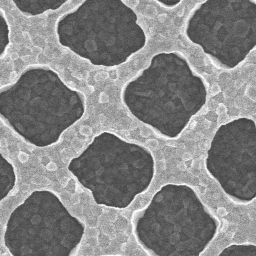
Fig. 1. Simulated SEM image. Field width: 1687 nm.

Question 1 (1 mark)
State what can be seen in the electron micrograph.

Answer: holes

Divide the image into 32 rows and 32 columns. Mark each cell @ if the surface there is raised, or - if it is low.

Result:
@@------@@------@@@@--@@@-------
@@@--@@@@--------@@@@@@@--------
-@@@@@@----------@@@@@@@--------
-@@@@@@-----------@@@@@---------
-@@@@@@-----------@@@@@---------
-@@@@@@@----------@@@@@@@-------
@@@@@@@@@--------@@@@@@@@@-----@
@@@@@@@@@@@-----@@@----@@@@---@@
@@@@--@@@@@@@@@@@@------@@@@-@@@
@@@----@@@@@@@@@@--------@@@@@@@
@@------@@@@@@@@---------@@@@@@@
----------@@@@@@----------@@@@@@
----------@@@@@-----------@@@@@@
-----------@@@@@---------@@@@@@@
----------@@@@@@@-------@@@@@@@@
@--------@@@@@@@@@-----@@@@@----
@@------@@@@@@@@@@@@---@@@@-----
@@@----@@@@@---@@@@@@@@@@@@-----
@@@@@@@@@@@-------@@@@@@@@------
@@@@@@@@@@---------@@@@@@@------
-@@@@@@@@----------@@@@@@@------
--@@@@@@@----------@@@@@@@------
--@@@@@@@@---------@@@@@@@@-----
--@@@@@@@@@-------@@----@@@@----
-@@@---@@@@@-----@@------@@@@---
@@@-----@@@@----@@@------@@@@@@@
@@-------@@@@@@@@@--------@@@@@@
@---------@@@@@@@----------@@@@@
@----------@@@@@@----------@@@@@
@---------@@@@@@@----------@@@@@
@---------@@@@@@@@--------@@@@@@
@--------@@@@@@@@@@------@@@----